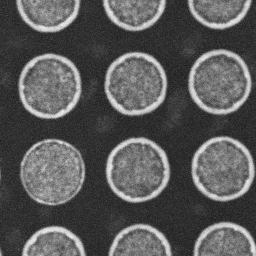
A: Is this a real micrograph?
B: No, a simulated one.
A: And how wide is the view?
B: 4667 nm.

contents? raised bodies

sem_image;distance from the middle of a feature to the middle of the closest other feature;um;1.55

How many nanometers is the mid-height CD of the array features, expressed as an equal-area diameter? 1080